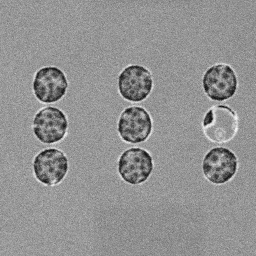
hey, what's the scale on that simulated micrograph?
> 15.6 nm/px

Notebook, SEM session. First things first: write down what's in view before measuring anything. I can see a regular array of holes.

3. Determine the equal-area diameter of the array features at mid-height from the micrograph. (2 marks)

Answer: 548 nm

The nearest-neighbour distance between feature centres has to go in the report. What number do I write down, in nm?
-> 642